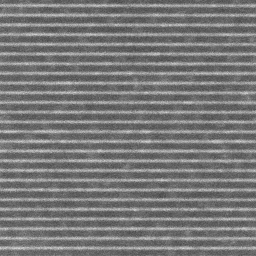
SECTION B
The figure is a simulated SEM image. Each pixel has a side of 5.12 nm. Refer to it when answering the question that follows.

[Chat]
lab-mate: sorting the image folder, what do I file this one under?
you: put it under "parallel lines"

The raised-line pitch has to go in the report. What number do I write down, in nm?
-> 49.7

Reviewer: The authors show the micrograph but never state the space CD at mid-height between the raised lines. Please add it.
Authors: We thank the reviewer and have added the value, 41 nm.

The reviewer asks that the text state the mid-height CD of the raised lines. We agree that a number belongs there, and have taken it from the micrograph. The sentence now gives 7.7 nanometres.